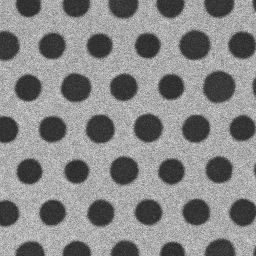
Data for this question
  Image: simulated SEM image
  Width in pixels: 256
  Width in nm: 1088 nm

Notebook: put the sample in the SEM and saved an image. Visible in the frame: a regular array of holes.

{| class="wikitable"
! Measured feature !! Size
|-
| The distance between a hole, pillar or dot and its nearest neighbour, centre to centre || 0.201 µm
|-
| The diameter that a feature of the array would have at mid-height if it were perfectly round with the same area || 112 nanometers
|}